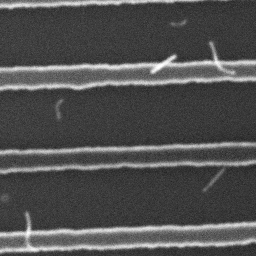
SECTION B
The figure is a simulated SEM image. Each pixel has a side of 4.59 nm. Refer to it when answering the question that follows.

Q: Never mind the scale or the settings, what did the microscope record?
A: lines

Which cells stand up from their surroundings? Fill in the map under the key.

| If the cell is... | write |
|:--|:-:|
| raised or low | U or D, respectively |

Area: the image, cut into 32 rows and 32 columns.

UUUUUUUUUUUDDDDDDDDDDDDDDDDDDDDD
DDDDDDDDDDDDDDDDDDDDDDDDDDDDDDDD
DDDDDDDDDDDDDDDDDDDDDDDDDDDDDDDD
DDDDDDDDDDDDDDDDDDDDDDDDDDDDDDDD
DDDDDDDDDDDDDDDDDDDDDDDDDDDDDDDD
DDDDDDDDDDDDDDDDDDDDDDDDDDDDDDDD
DDDDDDDDDDDDDDDDDDDDDDDDDDDDDDDD
DDDDDDDDDDDDDDDDDDDDDDDDDDDDDDDD
DUUUUUUUUUUUUUUUUUUUUUUUUUUUUUUU
UUUUUUUUUUUUUUUUUUUUUUUUUUUUUUUU
UUUUUUUUUUUUUDUDDDDDDDDDDDDDDDDD
DDDDDDDDDDDDDDDDDDDDDDDDDDDDDDDD
DDDDDDDDDDDDDDDDDDDDDDDDDDDDDDDD
DDDDDDDDDDDDDDDDDDDDDDDDDDDDDDDD
DDDDDDDDDDDDDDDDDDDDDDDDDDDDDDDD
DDDDDDDDDDDDDDDDDDDDDDDDDDDDDDDD
DDDDDDDDDDDDDDDDDDDDDDDDDDDDDDDD
DDDDDDDDDDDDDDDDDDDDDDDDDDDDDDDD
DDDDDDDDDDDDDDDDDUUUUUUUUUUUUUUU
UUUUUUUUUUUUUUUUUUUUUUUUUUUUUUUU
UUUUUUUUUUUUUUUUUUUUUUUUUUUUUUUD
UDDDDDDDDDDDDDDDDDDDDDDDDDDDDDDD
DDDDDDDDDDDDDDDDDDDDDDDDDDDDDDDD
DDDDDDDDDDDDDDDDDDDDDDDDDDDDDDDD
DDDDDDDDDDDDDDDDDDDDDDDDDDDDDDDD
DDDDDDDDDDDDDDDDDDDDDDDDDDDDDDDD
DDDDDDDDDDDDDDDDDDDDDDDDDDDDDDDD
DDDDDDDDDDDDDDDDDDDDDDDDDDDDDDDD
DDDDDDDDDDDDDDDDDDUUUUUUUUUUUUUU
UUUUUUUUUUUUUUUUUUUUUUUUUUUUUUUU
UUUUUUUUUUUUUUUUUUUUUUUUUUUUUUDD
DDDDDDDDDDDDDDDDDDDDDDDDDDDDDDDD